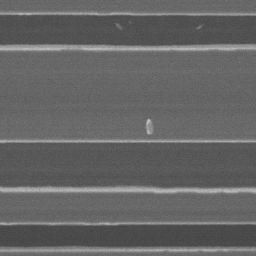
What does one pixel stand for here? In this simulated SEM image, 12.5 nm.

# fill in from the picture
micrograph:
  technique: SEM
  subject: lines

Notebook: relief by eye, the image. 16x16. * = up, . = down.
****************
................
................
****************
****************
****************
****************
****************
****************
................
................
................
****************
****************
................
................